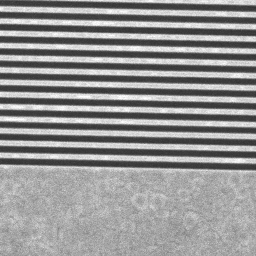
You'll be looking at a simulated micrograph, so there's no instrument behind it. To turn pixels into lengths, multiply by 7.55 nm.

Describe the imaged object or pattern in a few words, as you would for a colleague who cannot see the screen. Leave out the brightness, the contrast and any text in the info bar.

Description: parallel lines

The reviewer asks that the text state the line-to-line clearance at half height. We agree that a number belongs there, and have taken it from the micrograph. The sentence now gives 46.2 nm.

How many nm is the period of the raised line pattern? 92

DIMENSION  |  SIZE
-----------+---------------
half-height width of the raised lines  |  45.3 nanometers